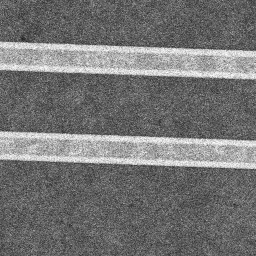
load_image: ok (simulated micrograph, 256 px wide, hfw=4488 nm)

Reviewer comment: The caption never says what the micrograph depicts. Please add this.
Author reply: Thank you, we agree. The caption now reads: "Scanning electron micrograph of one or a few lines or trenches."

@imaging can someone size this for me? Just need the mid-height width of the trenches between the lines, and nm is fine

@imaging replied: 1190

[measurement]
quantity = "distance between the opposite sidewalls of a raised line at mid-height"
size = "21.5 pixels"